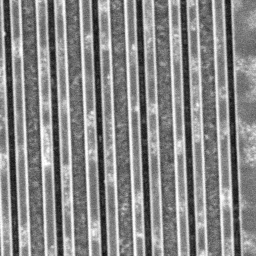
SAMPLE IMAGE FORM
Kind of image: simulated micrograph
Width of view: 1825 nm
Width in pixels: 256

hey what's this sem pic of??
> parallel lines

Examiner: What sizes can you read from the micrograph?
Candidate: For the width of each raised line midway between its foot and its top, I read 76.6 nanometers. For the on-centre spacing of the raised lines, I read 160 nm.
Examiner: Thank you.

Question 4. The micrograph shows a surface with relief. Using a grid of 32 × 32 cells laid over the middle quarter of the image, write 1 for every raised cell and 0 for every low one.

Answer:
10000110011100001100111000011001
10000110011100001100111000011001
10000110011100001100011000011001
10000110011100001100011000011100
10000110011100001100011000011100
10000110011100001100011000011100
10000110011100001100011000011100
10000111001100001100011000011100
10000111001100001110011000011100
10000111001100001110011000011100
10000111001100001110011000011100
10000111001100001110011000011100
10000111001100001110011000011100
10000111001100001110011000011100
10000111001100000110011000011100
10000111001100000110011000001100
10000111001100000110011000001100
10000111001100000110011000001100
10000111001100000110011000001100
10000111001100000110011000001100
11000011001100000110011000001100
11000011001110000110011000001100
11000011001110000110011100001100
11000011001110000110011100001100
11000011001110000110011100001100
11000011001110000110011100001100
11000011001110000110011100001100
11000011001110000110011100001100
11000011001110000110001100001100
11000011001110000110001100001110
11000011001110000110001100001110
11000011001110000110001100001110